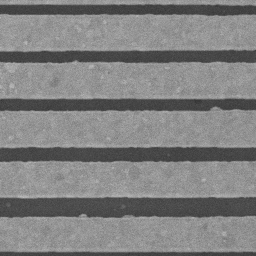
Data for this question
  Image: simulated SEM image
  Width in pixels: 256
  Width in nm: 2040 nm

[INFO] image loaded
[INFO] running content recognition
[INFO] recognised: lines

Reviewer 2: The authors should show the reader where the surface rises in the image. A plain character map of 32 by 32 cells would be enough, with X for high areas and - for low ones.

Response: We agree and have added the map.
--------------------------------
--------------------------------
XXXXXXXXXXXXXXXXXXXXXXXXXXXXXXXX
XXXXXXXXXXXXXXXXXXXXXXXXXXXXXXXX
XXXXXXXXXXXXXXXXXXXXXXXXXXXXXXXX
XXXXXXXXXXXXXXXXXXXXXXXXXXXXXXXX
--------------------------------
--------------------------------
XXXXXXXXXXXXXXXXXXXXXXXXXXXXXXXX
XXXXXXXXXXXXXXXXXXXXXXXXXXXXXXXX
XXXXXXXXXXXXXXXXXXXXXXXXXXXXXXXX
XXXXXXXXXXXXXXXXXXXXXXXXXXXXXXXX
--------------------------------
--------------------------------
XXXXXXXXXXXXXXXXXXXXXXXXXXXXXXXX
XXXXXXXXXXXXXXXXXXXXXXXXXXXXXXXX
XXXXXXXXXXXXXXXXXXXXXXXXXXXXXXXX
XXXXXXXXXXXXXXXXXXXXXXXXXXXXXXXX
--------------------------------
--------------------------------
XXXXXXXXXXXXXXXXXXXXXXXXXXXXXXXX
XXXXXXXXXXXXXXXXXXXXXXXXXXXXXXXX
XXXXXXXXXXXXXXXXXXXXXXXXXXXXXXXX
XXXXXXXXXXXXXXXXXXXXXXXXXXXXXXXX
XXXXXXXXXXX----XXXXXXXXXXXXXXX-X
--------------------------------
--------------------------------
XXXXXXXXXXXXXXXXXXXXXXXXXXXXXXXX
XXXXXXXXXXXXXXXXXXXXXXXXXXXXXXXX
XXXXXXXXXXXXXXXXXXXXXXXXXXXXXXXX
XXXXXXXXXXXXXXXXXXXXXXXXXXXXXXXX
--------------------------------